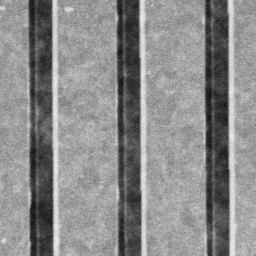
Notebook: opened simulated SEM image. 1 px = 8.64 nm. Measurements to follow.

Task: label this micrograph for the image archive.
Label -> lines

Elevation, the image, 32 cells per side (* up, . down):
***....*******....*******....***
***....*******....*******....***
***....*******....*******....***
***....*******....*******....***
***....*******....*******....***
***....*******....*******....***
***....*******....*******....***
***....*******....*******....***
***....*******....*******....***
***....*******....*******....***
****...********...*******....***
****...********...*******....***
****...********...*******....***
****...********...*******....***
****...********...********...***
****...********...********...***
****...********...********...***
****...********...********...***
****...********...********...***
****...********...********...***
****...********...********...***
****...********...********...***
****...********...********...***
****...********...********...***
****...********...********...***
****...********...********...***
****...********...********...***
****...********...********...***
****...********...********...***
****...********...********...***
****...********...********...***
****...********...********...***